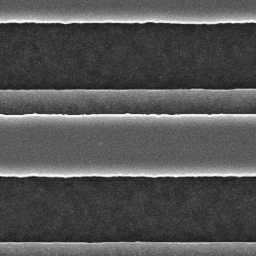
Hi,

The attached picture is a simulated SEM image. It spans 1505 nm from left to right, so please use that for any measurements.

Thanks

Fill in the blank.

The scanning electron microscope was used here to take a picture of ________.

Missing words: lines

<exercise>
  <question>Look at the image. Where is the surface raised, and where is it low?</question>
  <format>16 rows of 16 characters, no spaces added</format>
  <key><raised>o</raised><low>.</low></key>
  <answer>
oooooooooooooooo
................
................
................
................
................
ooooo.ooo.o.oooo
oooooooooooooooo
oooooooooooooooo
oooooooooooooooo
oooooooooooooooo
................
................
................
................
oooooooooooooooo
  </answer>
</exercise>